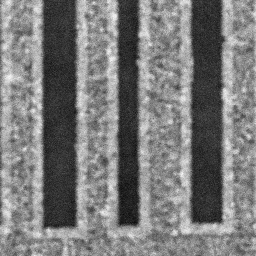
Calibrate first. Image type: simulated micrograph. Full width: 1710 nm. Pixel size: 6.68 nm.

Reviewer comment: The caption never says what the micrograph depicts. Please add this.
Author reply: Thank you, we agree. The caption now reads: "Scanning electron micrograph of one or a few lines or trenches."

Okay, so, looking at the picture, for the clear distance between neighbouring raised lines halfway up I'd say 0.283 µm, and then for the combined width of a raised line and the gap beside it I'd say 71.5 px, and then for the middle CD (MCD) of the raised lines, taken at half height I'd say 214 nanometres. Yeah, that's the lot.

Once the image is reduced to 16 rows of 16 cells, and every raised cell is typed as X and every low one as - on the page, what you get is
XX---XX--XXX--XX
XX---XX--XXX--XX
XX---XX--XXX--XX
XX---XX--XXX--XX
XX---XX--XXX--XX
XX---XX--XXX--XX
XX---XX--XXX--XX
XX---XX--XXX--XX
XX---XX--XXX--XX
XX---XX--XXX--XX
XX---XX--XXX--XX
XX---XX--XXX--XX
XX---XX--XXX--XX
XX---XX--XXX--XX
XXX--XX--XXXXXXX
XXXXXXXXXXXXXXXX